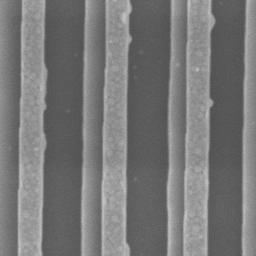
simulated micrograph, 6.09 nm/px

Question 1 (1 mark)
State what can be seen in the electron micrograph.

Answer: lines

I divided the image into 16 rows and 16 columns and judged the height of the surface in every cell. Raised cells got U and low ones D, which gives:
UUUDDUUUDDDUUDDU
UUUDDUUUDDDUUDDU
UUUDDUUUDDDUUDDU
UUUDDUUUDDDUUDDU
UUUDDUUUDDDUUDDU
UUUDDUUUDDDUUDDU
UUUDDUUUDDDUUDDU
UUUDDUUUDDDUUDDU
UUUDDUUUDDDUUDDU
UUUDDUUUDDDUUDDU
UUUDDUUUDDDUUDDU
UUUDDUUUDDDUUDDU
UUUDDUUUDDDUUDDU
UUUDDUUUDDDUUDDU
UUUDDUUUDDDUUDDU
UUUDDUUUDDDUUDDU